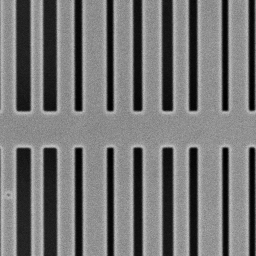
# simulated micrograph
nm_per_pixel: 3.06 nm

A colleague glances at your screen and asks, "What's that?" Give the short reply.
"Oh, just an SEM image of groups of lines, slits or small figures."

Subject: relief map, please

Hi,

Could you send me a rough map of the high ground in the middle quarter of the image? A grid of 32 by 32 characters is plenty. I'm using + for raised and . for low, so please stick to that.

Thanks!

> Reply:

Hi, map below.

+++..++++++..++++...++++...++++.
+++..++++++..++++...++++...++++.
+++..++++++..++++...++++...++++.
+++..++++++..++++...++++...++++.
+++..++++++..++++...++++...++++.
+++..++++++..++++...++++...++++.
+++..++++++..++++...++++...++++.
+++..++++++..++++...++++...++++.
+++..++++++..++++...++++...++++.
+++..++++++..++++...++++...++++.
+++..++++++..++++...++++...++++.
+++..++++++.+++++..++++++..++++.
++++++++++++++++++++++++++++++++
++++++++++++++++++++++++++++++++
++++++++++++++++++++++++++++++++
++++++++++++++++++++++++++++++++
++++++++++++++++++++++++++++++++
++++++++++++++++++++++++++++++++
++++++++++++++++++++++++++++++++
++++++++++++++++++++++++++++++++
++++++++++++++++++++++++++++++++
+++..++++++..++++...++++...++++.
+++..++++++..++++...++++...++++.
+++..++++++..++++...++++...++++.
+++..++++++..++++...++++...++++.
+++..++++++..++++...++++...++++.
+++..++++++..++++...++++...++++.
+++..++++++..++++...++++...++++.
+++..++++++..++++...++++...++++.
+++..++++++..++++...++++...++++.
+++..++++++..++++...++++...++++.
+++..++++++..++++...++++...++++.